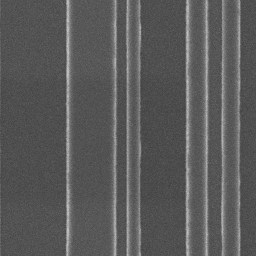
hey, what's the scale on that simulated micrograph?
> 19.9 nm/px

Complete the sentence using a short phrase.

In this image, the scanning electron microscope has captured lines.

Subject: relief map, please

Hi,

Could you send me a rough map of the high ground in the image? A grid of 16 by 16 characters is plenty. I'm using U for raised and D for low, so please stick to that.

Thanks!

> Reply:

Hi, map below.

DDDDUUUUUDDDUUUD
DDDDUUUUUDDDUUUD
DDDDUUUUUDDDUUUD
DDDDUUUUUDDDUUUD
DDDDUUUUUDDDUUUD
DDDDUUUUUDDDUUUD
DDDDUUUUUDDDUUUD
DDDDUUUUUDDDUUUD
DDDDUUUUUDDDUUUD
DDDDUUUUUDDDUUUD
DDDDUUUUUDDDUUUD
DDDDUUUUUDDDUUUD
DDDDUUUUUDDDUUUD
DDDDUUUUUDDDUUUD
DDDDUUUUUDDDUUUD
DDDDUUUUUDDDUUUD